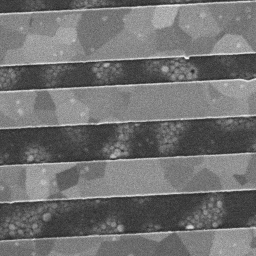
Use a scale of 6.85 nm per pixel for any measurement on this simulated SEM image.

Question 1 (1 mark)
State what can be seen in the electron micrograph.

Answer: one or a few lines or trenches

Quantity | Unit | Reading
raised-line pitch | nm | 492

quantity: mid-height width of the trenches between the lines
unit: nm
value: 253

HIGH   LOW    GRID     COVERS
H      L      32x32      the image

LLLLLLLLLLLLLLLLLLLLLLLHHHHHHHHH
LLLLHHHHHHHHHHHHHHHHHHHHHHHHHHHH
HHHHHHHHHHHHHHHHHHHHHHHHHHHHHHHH
HHHHHHHHHHHHHHHHHHHHHHHHHHHHHHHH
HHHHHHHHHHHHHHHHHHHHHHHHHHHHHHHH
HHHHHHHHHHHHHHHHHHHHHHHHHHHHHHHH
HHHHHHHHHHHHHHHHHHHHHHHHHHHHHHHH
HHHHHHHHHHHHHHHLLLLLLLLLLLLLLLLL
LLLLLLLLLLLLLLLLLLLLLLLLLLLLLLLL
LLLLLLLLLLLLLLLLLLLLLLLLLLLLLLLL
LLLLLLLLLLLLLLLLLLLLHHHHHHHHHHHH
HHHHHHHHHHHHHHHHHHHHHHHHHHHHHHHH
HHHHHHHHHHHHHHHHHHHHHHHHHHHHHHHH
HHHHHHHHHHHHHHHHHHHHHHHHHHHHHHHH
HHHHHHHHHHHHHHHHHHHHHHHHHHHHHHLL
HHHHHHHHHHHHLLLLLLLLLLLLLLLLLLLL
LLLLLLLLLLLLLLLLLLLLLLLLLLLLLLLL
LLLLLLLLLLLLLLLLLLLLLLLLLLLLLLLL
LLLLLLLLLLLLLLLLLLLLLLLLLLLLLLLL
LLLLLLLLLLLLLLLLLLLLLLLLLHHHHHHH
LLLHLHHHHHHHHHHHHHHHHHHHHHHHHHHH
HHHHHHHHHHHHHHHHHHHHHHHHHHHHHHHH
HHHHHHHHHHHHHHHHHHHHHHHHHHHHHHHH
HHHHHHHHHHHHHHHHHHHHHHHHHHHHHHHH
HHHHHHHHHHHHHHHHLLLLLLLLLLLLLLLL
LLLLLLLLLLLLLLLLLLLLLLLLLLLLLLLL
LLLLLLLLLLLLLLLLLLLLLLLLLLLLLLLL
LLLLLLLLLLLLLLLLLLLLLLLLLLLLLLLL
LLLLLLLLLLLLLLLLLLLLLLLLLLLLLLLH
LLLLLLLLLLLLHHHHHHHHHHHHHHHHHHHH
HHHHHHHHHHHHHHHHHHHHHHHHHHHHHHHH
HHHHHHHHHHHHHHHHHHHHHHHHHHHHHHHH